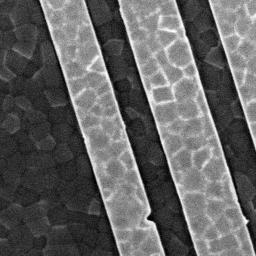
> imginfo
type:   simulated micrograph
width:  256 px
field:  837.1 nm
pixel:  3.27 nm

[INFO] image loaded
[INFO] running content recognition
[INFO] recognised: one or a few lines or trenches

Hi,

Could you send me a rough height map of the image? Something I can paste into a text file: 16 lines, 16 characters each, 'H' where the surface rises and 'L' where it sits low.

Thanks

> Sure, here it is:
LLLHHLLLHHHLLHHH
LLLHHHLLHHHLLLHH
LLLHHHLLHHHHLLHH
LLLLHHLLHHHHLLHH
LLLLHHHLLHHHLLHH
LLLLHHHLLHHHHLLH
LLLLLHHLLHHHHLLH
LLLLLHHHLLHHHLLH
LLLLLHHHLLHHHHLL
LLLLLLHHLLHHHHLL
LLLLLLHHHLLHHHLL
LLLLLLHHHLLHHHHL
LLLLLLHHHLLHHHHL
LLLLLLLHHLLLHHHL
LLLLLLLHHHLLHHHL
LLLLLLLHHHLLHHHH